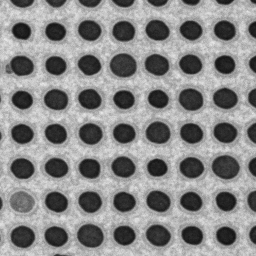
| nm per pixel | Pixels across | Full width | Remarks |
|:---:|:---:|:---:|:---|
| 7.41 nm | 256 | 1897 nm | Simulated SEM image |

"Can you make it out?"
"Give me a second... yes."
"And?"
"a regular array of holes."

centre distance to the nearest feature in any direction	247	nanometers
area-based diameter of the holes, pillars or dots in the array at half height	163	nm